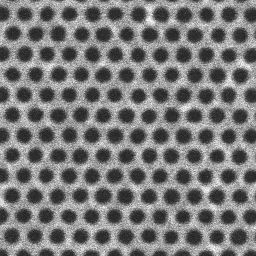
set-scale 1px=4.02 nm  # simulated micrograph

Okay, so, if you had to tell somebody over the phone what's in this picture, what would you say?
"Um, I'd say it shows a regular array of holes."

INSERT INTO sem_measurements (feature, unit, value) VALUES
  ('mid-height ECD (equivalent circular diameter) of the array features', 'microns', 0.0621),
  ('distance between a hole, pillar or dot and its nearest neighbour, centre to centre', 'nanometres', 90.6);